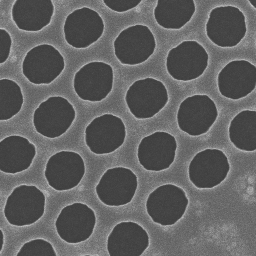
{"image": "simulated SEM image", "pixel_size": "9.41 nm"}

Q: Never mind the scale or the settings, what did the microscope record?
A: a regular array of holes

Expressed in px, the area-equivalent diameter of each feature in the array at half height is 40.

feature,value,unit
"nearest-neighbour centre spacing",0.504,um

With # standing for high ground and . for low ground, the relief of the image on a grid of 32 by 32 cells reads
##.....######....###....#######.
##.....##...#######.....##....##
##....##.....#######....##.....#
###..###.....###..###.####.....#
.#######.....##....#######....##
.########..###.....####..##...##
.###...#######.....##.....######
.##.....#######...###.....######
###.....##....#######.....##....
###....##.....########...##.....
..#######.....###...#######.....
...#######....##.....#######...#
...###..###..###.....##...######
...##....#######....##.....#####
..##.....####.###..###.....##...
####.....##....#######.....##...
#####...###.....#######...###...
...########.....##....#######...
....#######....##.....########..
....###...#######.....##....####
....##.....#######...###.....###
#.####.....##....#######....####
######....###....#######....####
##...##..###.....###..##########
#.....######.....##....#########
#.....###.###...##.....#########
#....###....######.....#########
#....##.....#######...##########
#######.....##....##############
########...###.....#############
###...#######......#############
##.....#######....##############